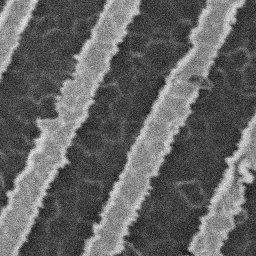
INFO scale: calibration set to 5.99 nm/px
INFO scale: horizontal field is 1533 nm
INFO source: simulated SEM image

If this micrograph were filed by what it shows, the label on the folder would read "one or a few lines or trenches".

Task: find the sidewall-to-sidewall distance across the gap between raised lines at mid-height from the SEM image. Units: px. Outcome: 60.7